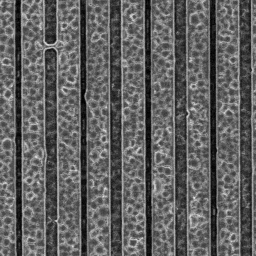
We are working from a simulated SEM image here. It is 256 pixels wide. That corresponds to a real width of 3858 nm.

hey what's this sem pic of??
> parallel lines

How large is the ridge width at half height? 343 nm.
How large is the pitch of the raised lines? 489 nm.